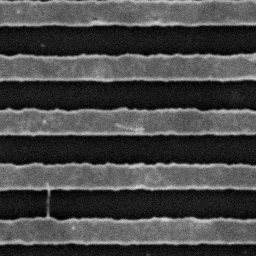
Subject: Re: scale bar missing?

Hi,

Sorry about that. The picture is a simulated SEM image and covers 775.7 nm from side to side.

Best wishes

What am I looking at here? lines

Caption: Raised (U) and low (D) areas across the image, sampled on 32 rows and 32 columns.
UUUUUUUUUUUUUUUUUUUUUUUUUUUUUUUU
UUUUUUUUUUUUUUUUUUUUUUUUUUUUUUUU
UUUUUUUUUUUUUUUUUUUUUUUUUUUUUUUU
DDDDDDDDDDDDDDDDDDDDDDDDDDDDDDDD
DDDDDDDDDDDDDDDDDDDDDDDDDDDDDDDD
DDDDDDDDDDDDDDDDDDDDDDDDDDDDDDDD
DDDDDDDDDDDDDDDDDDDDDDDDDDDDDDDD
UUUUUUUUUUUUUUUUUUUUUUUUUUUUUUUU
UUUUUUUUUUUUUUUUUUUUUUUUUUUUUUUU
UUUUUUUUUUUUUUUUUUUUUUUUUUUUUUUU
DDDDDDDDDDDDDDDDDDDDDDDDDDDDDDDD
DDDDDDDDDDDDDDDDDDDDDDDDDDDDDDDD
DDDDDDDDDDDDDDDDDDDDDDDDDDDDDDDD
DDDDDDDDDDDDDDDUDDDDDDDDDDDDDDDD
UUUUUUUUUUUUUUUUUUUUUUUUUUUUUUUU
UUUUUUUUUUUUUUUUUUUUUUUUUUUUUUUU
UUUUUUUUUUUUUUUUUUUUUUUUUUUUUUUU
DDDDDDDDDDDDDDDDDDDDDDDDDDDDDDDD
DDDDDDDDDDDDDDDDDDDDDDDDDDDDDDDD
DDDDDDDDDDDDDDDDDDDDDDDDDDDDDDDD
DDDDUDDDDUDDDUDDDUDDDUDDDDDDDDDD
UUUUUUUUUUUUUUUUUUUUUUUUUUUUUUUU
UUUUUUUUUUUUUUUUUUUUUUUUUUUUUUUU
UUUUUUUUUUUUUUUUUUUUUUUUUUUUUUUU
DDDDDDDDDDDDDDDDDDDDDDDDDDDDDDDD
DDDDDDDDDDDDDDDDDDDDDDDDDDDDDDDD
DDDDDDDDDDDDDDDDDDDDDDDDDDDDDDDD
DDUUUUUDUUUUUUUUDUUUUUUUUUUUUUDU
UUUUUUUUUUUUUUUUUUUUUUUUUUUUUUUU
UUUUUUUUUUUUUUUUUUUUUUUUUUUUUUUU
DDDUDDDDDDDDDDDDDDDDDDDDDDDDDDDD
DDDDDDDDDDDDDDDDDDDDDDDDDDDDDDDD